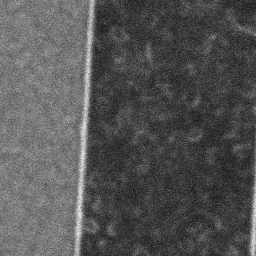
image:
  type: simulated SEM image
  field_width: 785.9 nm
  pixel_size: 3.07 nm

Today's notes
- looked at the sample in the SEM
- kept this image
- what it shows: one or a few lines or trenches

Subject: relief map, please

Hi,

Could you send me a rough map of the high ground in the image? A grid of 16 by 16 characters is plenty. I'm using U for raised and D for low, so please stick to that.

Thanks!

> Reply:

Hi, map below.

DDDDDDUUUUUUUUUU
DDDDDDUUUUUUUUUU
DDDDDDUUUUUUUUUU
DDDDDDUUUUUUUUUU
DDDDDUUUUUUUUUUU
DDDDDUUUUUUUUUUU
DDDDDUUUUUUUUUUU
DDDDDUUUUUUUUUUU
DDDDDUUUUUUUUUUU
DDDDDUUUUUUUUUUU
DDDDDUUUUUUUUUUU
DDDDDUUUUUUUUUUU
DDDDDUUUUUUUUUUU
DDDDDUUUUUUUUUUU
DDDDDUUUUUUUUUUU
DDDDDUUUUUUUUUUU